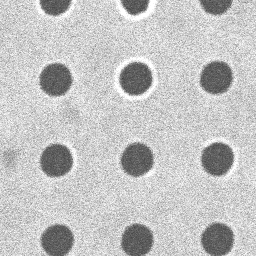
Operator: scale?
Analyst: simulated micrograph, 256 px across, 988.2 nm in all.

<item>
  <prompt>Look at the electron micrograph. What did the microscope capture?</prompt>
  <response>holes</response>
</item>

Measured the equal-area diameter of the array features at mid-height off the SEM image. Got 131 nm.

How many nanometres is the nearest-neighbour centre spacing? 311